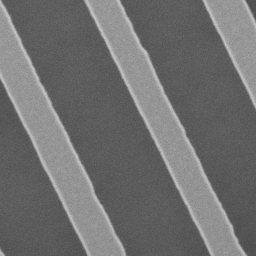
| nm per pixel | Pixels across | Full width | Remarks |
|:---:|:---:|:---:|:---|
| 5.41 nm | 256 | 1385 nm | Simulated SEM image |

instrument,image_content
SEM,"lines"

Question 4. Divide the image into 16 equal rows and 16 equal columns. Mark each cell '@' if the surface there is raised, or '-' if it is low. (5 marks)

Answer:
------@@-----@@@
@-----@@-----@@@
@------@@-----@@
@@-----@@-----@@
@@------@@-----@
@@@-----@@-----@
-@@-----@@@-----
-@@@-----@@-----
--@@-----@@@----
--@@@-----@@----
---@@-----@@@---
---@@@-----@@---
----@@-----@@@--
----@@@-----@@--
-----@@-----@@@-
-----@@@-----@@-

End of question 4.